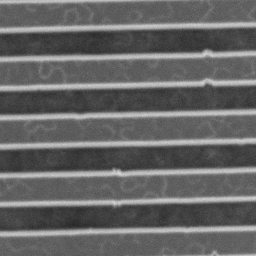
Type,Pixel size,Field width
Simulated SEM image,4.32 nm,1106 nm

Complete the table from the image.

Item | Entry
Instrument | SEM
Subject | parallel lines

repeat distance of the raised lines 0.252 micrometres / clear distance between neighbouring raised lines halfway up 120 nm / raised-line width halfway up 0.131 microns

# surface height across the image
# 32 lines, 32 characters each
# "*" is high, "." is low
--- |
********************************
********************************
********************************
*************...................
................................
................................
................................
********************************
********************************
********************************
************************........
................................
................................
................................
......**************************
********************************
********************************
********************************
................................
................................
................................
..............*.......**********
********************************
********************************
********************************
****............................
................................
................................
................................
********************************
********************************
********************************